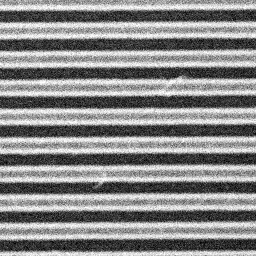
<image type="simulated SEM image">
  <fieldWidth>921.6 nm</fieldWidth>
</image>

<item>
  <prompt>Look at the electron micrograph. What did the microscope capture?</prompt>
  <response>parallel lines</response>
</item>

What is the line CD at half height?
45.4 nm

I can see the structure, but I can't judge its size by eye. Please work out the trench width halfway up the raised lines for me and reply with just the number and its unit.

57.6 nanometers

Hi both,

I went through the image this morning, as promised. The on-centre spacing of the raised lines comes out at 103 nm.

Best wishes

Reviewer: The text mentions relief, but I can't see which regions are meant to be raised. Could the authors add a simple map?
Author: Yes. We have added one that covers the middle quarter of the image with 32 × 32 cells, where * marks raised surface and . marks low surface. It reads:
................................
................................
................................
................................
********************************
********************************
********************************
.........................**.....
................................
................................
................................
................................
********************************
********************************
*******************.**..........
................................
................................
................................
................................
********************************
********************************
********************************
................................
................................
................................
................................
********************************
********************************
********************************
................................
................................
................................